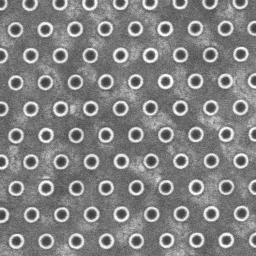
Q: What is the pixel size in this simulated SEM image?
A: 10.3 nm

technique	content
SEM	a regular array of raised bodies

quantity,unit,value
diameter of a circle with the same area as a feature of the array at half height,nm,141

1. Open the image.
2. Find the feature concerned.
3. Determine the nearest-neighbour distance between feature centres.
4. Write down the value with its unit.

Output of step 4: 307 nanometres